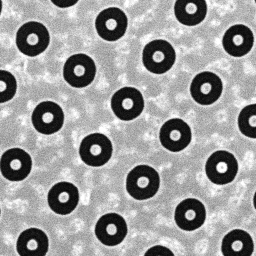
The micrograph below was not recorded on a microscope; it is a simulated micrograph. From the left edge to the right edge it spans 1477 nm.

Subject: a regular array of ring-shaped grooves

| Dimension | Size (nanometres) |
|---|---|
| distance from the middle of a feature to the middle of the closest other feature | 326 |